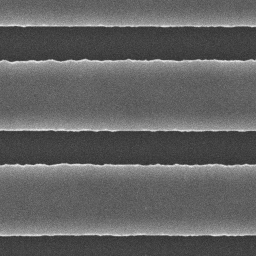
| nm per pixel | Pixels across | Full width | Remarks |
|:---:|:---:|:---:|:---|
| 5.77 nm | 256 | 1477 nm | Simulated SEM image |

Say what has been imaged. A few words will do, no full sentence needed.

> lines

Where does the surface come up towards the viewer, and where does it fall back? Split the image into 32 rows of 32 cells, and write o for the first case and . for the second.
oooooooooooooooooooooooooooooooo
oooooooooooooooooooooooooooooooo
oooooooooooooooooooooooooooooooo
................................
................................
................................
................................
......o...o....oo..o....ooo....o
oooooooooooooooooooooooooooooooo
oooooooooooooooooooooooooooooooo
oooooooooooooooooooooooooooooooo
oooooooooooooooooooooooooooooooo
oooooooooooooooooooooooooooooooo
oooooooooooooooooooooooooooooooo
oooooooooooooooooooooooooooooooo
oooooooooooooooooooooooooooooooo
................................
................................
................................
................................
................................
oooooooooooooooooooooooooooooooo
oooooooooooooooooooooooooooooooo
oooooooooooooooooooooooooooooooo
oooooooooooooooooooooooooooooooo
oooooooooooooooooooooooooooooooo
oooooooooooooooooooooooooooooooo
oooooooooooooooooooooooooooooooo
oooooooooooooooooooooooooooooooo
................................
................................
................................